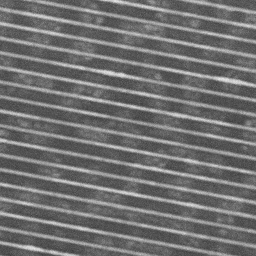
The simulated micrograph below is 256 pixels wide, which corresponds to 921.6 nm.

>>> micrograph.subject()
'parallel lines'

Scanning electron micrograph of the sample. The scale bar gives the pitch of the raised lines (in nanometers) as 51.7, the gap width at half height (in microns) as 0.0447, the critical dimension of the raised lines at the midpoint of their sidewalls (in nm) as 8.4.